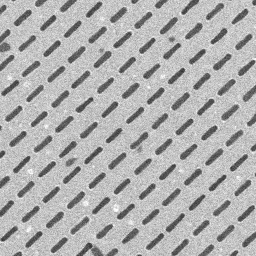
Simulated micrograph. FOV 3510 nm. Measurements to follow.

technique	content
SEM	a regular array of holes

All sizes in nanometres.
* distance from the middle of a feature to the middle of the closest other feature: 344